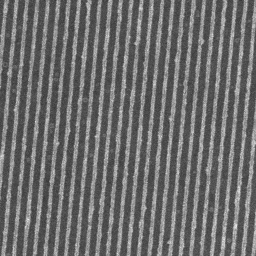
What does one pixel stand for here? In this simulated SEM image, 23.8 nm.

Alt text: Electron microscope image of parallel lines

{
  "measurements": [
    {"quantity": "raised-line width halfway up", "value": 77.1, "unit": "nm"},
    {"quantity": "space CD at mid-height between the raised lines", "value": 0.175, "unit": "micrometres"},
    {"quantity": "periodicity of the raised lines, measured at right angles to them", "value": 247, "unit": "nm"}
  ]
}